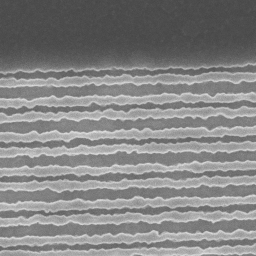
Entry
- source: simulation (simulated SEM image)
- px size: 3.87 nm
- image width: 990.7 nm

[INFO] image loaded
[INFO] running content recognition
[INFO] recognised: parallel lines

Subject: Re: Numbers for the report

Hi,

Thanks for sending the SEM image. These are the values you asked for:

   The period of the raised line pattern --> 0.0677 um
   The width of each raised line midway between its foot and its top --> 32.9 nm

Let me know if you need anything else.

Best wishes